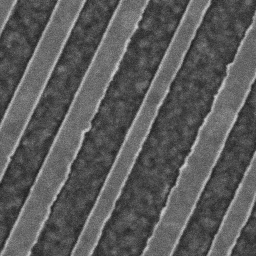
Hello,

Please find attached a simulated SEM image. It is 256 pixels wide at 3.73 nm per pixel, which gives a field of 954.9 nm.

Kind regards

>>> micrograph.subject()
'one or a few lines or trenches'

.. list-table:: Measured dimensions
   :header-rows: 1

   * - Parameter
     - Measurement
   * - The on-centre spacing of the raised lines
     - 229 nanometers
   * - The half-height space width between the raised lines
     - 141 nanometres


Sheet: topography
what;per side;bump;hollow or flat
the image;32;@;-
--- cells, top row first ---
@@-----@@@-----@@@------@@------
@------@@@----@@@@-----@@@------
@-----@@@-----@@@@-----@@-------
------@@@----@@@@-----@@@------@
-----@@@@----@@@------@@-------@
-----@@@-----@@@-----@@@------@@
----@@@@----@@@@-----@@-------@@
----@@@-----@@@-----@@@------@@@
---@@@@----@@@@-----@@------@@@@
---@@@-----@@@-----@@@------@@@@
--@@@@----@@@@-----@@-------@@@@
--@@@-----@@@-----@@@------@@@@-
--@@@----@@@@-----@@-------@@@@-
-@@@-----@@@------@@-------@@@--
-@@@----@@@@-----@@-------@@@@--
@@@-----@@@------@@------@@@@---
@@@----@@@@-----@@@------@@@@---
@@-----@@@------@@-------@@@----
@@----@@@@-----@@@------@@@@----
@-----@@@------@@-------@@@-----
@----@@@@-----@@@------@@@@----@
-----@@@@-----@@-------@@@-----@
-----@@@-----@@@------@@@@----@@
----@@@@-----@@-------@@@-----@@
----@@@-----@@@------@@@@----@@@
---@@@------@@-------@@@-----@@@
---@@@-----@@@------@@@@----@@@-
--@@@@-----@@-------@@@-----@@@-
--@@@-----@@@------@@@@-----@@--
-@@@@-----@@-------@@@@----@@@--
-@@@------@@------@@@@-----@@---
@@@@-----@@-------@@@@----@@@---